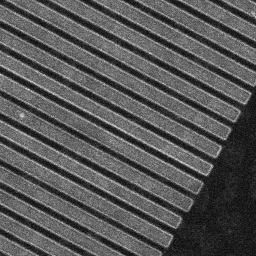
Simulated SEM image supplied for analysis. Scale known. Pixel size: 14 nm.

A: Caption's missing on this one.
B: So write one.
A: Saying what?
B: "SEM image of parallel lines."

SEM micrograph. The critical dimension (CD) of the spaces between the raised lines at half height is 166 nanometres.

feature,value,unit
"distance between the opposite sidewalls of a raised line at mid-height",127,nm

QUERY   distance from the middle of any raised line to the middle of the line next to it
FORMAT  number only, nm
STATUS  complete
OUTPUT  285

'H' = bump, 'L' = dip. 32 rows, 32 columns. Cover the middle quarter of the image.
LLHHHHLLLLLLHHHHLLLLLLLHHHHHLLLL
LLLLHHHHLLLLLLHHHHLLLLLLLHHHHLLL
LLLLLHHHHHLLLLLLHHHHLLLLLLLHHHHL
HLLLLLLHHHHLLLLLLLHHHHLLLLLLLHHH
HHHLLLLLLHHHHLLLLLLLHHHHLLLLLLHH
HHHHHLLLLLLHHHHLLLLLLLHHHHLLLLLL
LLHHHHLLLLLLLHHHHLLLLLLLHHHHLLLL
LLLLHHHHLLLLLLLHHHHLLLLLLHHHHLLL
LLLLLLHHHHLLLLLLLHHHHLLLLLLHHHHL
HLLLLLLHHHHHLLLLLLHHHHHLLLLLLHHH
HHHLLLLLLHHHHHLLLLLLHHHHLLLLLLLH
LHHHHLLLLLLHHHHHLLLLLLHHHHLLLLLL
LLHHHHHLLLLLLHHHHHLLLLLLHHHHLLLL
LLLLHHHHHLLLLLLHHHHLLLLLLLHHHHLL
LLLLLLHHHHHLLLLLLHHHHLLLLLLLHHHH
HHLLLLLLHHHHHLLLLLLHHHHLLLLLLLHH
HHHLLLLLLLHHHHLLLLLLHHHHHLLLLLLL
LHHHHLLLLLLLHHHHLLLLLLHHHHHLLLLL
LLLHHHHLLLLLLLHHHHLLLLLLHHHHHLLL
LLLLLHHHHLLLLLLHHHHHLLLLLLHHHHHL
LLLLLLLHHHHLLLLLLHHHHHLLLLLLHHHH
HHLLLLLLLHHHHLLLLLLHHHHHLLLLLLHH
HHHHLLLLLLHHHHHLLLLLLHHHHHLLLLLL
LHHHHHLLLLLLHHHHLLLLLLLHHHHHLLLL
LLLHHHHHLLLLLLHHHHLLLLLLLHHHHLLL
LLLLLHHHHHLLLLLLHHHHLLLLLLLHHHHL
HLLLLLLHHHHLLLLLLLHHHHLLLLLLLHHH
HHHLLLLLLHHHHLLLLLLLHHHHLLLLLLHH
HHHHHLLLLLLHHHHLLLLLLLHHHHLLLLLL
LLHHHHLLLLLLHHHHHLLLLLLLHHHHLLLL
LLLLHHHHLLLLLLHHHHHLLLLLLHHHHLLL
LLLLLLHHHHLLLLLLHHHHHLLLLLLHHHHL